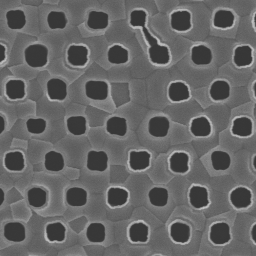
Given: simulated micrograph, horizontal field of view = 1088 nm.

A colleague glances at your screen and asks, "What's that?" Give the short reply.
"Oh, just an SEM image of a regular array of holes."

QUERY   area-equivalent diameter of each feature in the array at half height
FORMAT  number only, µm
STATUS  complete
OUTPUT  0.0833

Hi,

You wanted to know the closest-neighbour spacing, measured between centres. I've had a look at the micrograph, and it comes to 170 nm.